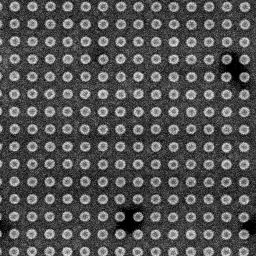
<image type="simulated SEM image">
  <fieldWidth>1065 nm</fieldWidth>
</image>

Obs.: a regular array of raised bodies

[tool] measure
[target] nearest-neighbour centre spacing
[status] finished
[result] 72.1 nm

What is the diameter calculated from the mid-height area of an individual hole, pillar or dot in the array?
39.3 nm